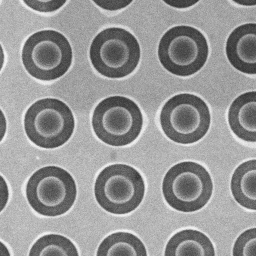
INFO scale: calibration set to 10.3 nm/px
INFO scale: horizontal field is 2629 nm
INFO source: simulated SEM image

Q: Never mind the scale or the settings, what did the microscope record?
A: an array of small figures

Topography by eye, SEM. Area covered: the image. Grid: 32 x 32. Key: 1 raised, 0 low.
11100000111100001111100011111000
11111001111110011111111111111111
11111111111111111111111111111111
11111111111110001111100011111100
11110000111100000111000000111000
11100000011000000111000000110000
01100000011000000011000000110000
01100000011000000111000000111000
11100000011100000111100001111000
11110000111110001111110011111111
11111111111111111111111111111111
11111111111111111111111111111110
11111001111110000111100001111000
11110000011100000011000000111000
01100000011000000011000000110000
01100000011000000011000000111000
01100000011100000011000000111000
11110000011100000111100001111100
11111001111111111111111111111111
11111111111111111111111111111111
11111111111111011111110001111100
11110000111100000111100000111000
01100000011100000011000000111000
01100000001100000011000000011000
01100000001100000011000000111000
01110000011100000011100000111100
11110000111111001111111011111111
11111111111111111111111111111111
11111111111111111111111111111110
11111000111110000111100000111100
01110000011100000011100000011000
01110000001100000011100000011000